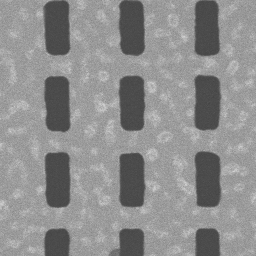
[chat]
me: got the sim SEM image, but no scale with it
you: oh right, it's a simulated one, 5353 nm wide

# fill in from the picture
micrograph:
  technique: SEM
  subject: holes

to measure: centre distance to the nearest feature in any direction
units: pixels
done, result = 74.5